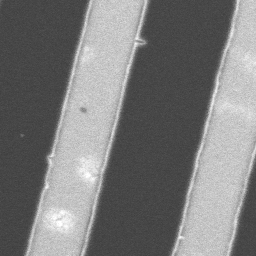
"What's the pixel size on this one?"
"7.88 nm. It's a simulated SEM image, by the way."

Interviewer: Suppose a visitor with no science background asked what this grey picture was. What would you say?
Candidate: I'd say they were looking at one or a few lines or trenches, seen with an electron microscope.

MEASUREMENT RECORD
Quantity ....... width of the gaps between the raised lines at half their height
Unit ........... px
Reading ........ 51.5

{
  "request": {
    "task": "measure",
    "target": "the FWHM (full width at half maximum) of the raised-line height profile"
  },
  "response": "713 nm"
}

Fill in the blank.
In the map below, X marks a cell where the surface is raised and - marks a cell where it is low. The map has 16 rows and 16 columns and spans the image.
XXXXXX---XXXXXX-
XXXXX----XXXXXX-
XXXXX----XXXXX--
XXXXX---XXXXXX--
XXXXX---XXXXXX--
XXXX----XXXXXX--
XXXX---XXXXXX---
XXXX---XXXXXX---
XXXX---XXXXXX---
XXX----XXXXXX---
XXX---XXXXXX----
XXX---XXXXXX---X
XXX---XXXXXX---X
XX----XXXXXX---X
XX----XXXXX----X
XX---XXXXXX---XX